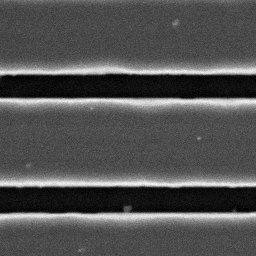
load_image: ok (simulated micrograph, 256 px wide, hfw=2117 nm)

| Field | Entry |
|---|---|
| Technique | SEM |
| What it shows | lines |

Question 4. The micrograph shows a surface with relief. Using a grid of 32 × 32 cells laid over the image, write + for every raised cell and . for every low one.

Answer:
++++++++++++++++++++++++++++++++
++++++++++++++++++++++++++++++++
++++++++++++++++++++++++++++++++
++++++++++++++++++++++++++++++++
++++++++++++++++++++++++++++++++
++++++++++++++++++++++++++++++++
++++++++++++++++++++++++++++++++
++++++++++++++++++++++++++++++++
++++++++++++++++++++++++++++++++
................................
................................
................................
++++++++++++++++++++++++++++++++
++++++++++++++++++++++++++++++++
++++++++++++++++++++++++++++++++
++++++++++++++++++++++++++++++++
++++++++++++++++++++++++++++++++
++++++++++++++++++++++++++++++++
++++++++++++++++++++++++++++++++
++++++++++++++++++++++++++++++++
++++++++++++++++++++++++++++++++
++++++++++++++++++++++++++++++++
++++++++++++++++++++++++++++++++
................................
................................
................................
................................
++++++++++++++++++++++++++++++++
++++++++++++++++++++++++++++++++
++++++++++++++++++++++++++++++++
++++++++++++++++++++++++++++++++
++++++++++++++++++++++++++++++++